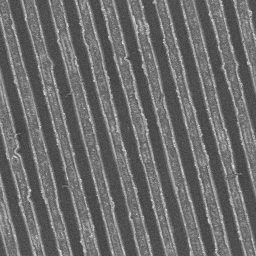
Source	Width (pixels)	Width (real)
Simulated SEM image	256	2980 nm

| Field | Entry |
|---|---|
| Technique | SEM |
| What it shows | parallel lines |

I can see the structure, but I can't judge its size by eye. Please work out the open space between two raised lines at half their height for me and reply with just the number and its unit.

158 nm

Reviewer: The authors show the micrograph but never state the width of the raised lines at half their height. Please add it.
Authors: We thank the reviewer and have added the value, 0.147 microns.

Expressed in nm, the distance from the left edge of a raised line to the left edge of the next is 299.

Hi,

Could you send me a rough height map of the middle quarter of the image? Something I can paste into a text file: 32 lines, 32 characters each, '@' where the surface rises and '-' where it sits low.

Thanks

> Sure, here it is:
@@@@---@@@---@@@@---@@@----@@@--
-@@@---@@@----@@@---@@@----@@@--
-@@@---@@@@---@@@---@@@@---@@@--
-@@@---@@@@---@@@@---@@@----@@--
-@@@----@@@---@@@@---@@@----@@@-
--@@@---@@@----@@@---@@@----@@@-
--@@@---@@@@---@@@---@@@----@@@-
--@@@----@@@---@@@----@@@---@@@-
--@@@----@@@----@@----@@@----@@@
---@@@---@@@----@@@---@@@----@@@
---@@@---@@@----@@@----@@----@@@
---@@@----@@@---@@@----@@@---@@@
---@@@@---@@@---@@@@---@@@----@@
----@@@---@@@----@@@---@@@----@@
----@@@---@@@----@@@@--@@@@---@@
@---@@@----@@----@@@@---@@@---@@
@---@@@@---@@@---@@@@---@@@----@
@----@@@---@@@----@@@---@@@----@
@----@@@----@@----@@@----@@-----
@----@@@----@@@---@@@----@@@----
@@----@@@---@@@----@@@---@@@----
@@----@@@---@@@----@@@----@@----
@@@---@@@----@@@---@@@----@@@---
@@@---@@@----@@@---@@@----@@@---
@@@----@@----@@@----@@@---@@@---
@@@----@@@----@@----@@@---@@@---
@@@----@@@----@@----@@@----@@@--
-@@@---@@@----@@@----@@----@@@--
-@@@---@@@----@@@----@@----@@@--
-@@@----@@@---@@@----@@@---@@@--
-@@@----@@@----@@@---@@@----@@@-
-@@@@---@@@----@@@----@@----@@@-